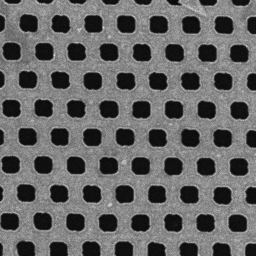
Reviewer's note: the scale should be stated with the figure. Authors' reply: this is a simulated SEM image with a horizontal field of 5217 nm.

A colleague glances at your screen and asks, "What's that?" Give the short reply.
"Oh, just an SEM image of a regular array of holes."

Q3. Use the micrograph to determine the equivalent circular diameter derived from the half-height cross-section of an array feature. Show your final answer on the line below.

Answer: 400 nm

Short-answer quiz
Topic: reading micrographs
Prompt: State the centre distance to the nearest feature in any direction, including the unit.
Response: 0.657 um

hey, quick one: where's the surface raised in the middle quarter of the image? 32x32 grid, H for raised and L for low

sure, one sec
HHHHHHHHHHHHHHHHHHHHHHHHHHHHHHHH
HHHHHHHHHHHHHHHHHHHHHHHHHHHHHHHH
LHHHHLLLLHHHHLLLLHHHHHLLLHHHHHLL
LHHHHLLLLLHHHLLLLLHHHLLLLLHHHLLL
LHHHHLLLLLHHHLLLLLHHHLLLLLHHHLLL
LHHHHLLLLHHHHLLLLLHHHLLLLLHHHLLL
HHHHHHLHHHHHHHHHHHHHHHLLLHHHHHHL
HHHHHHHHHHHHHHHHHHHHHHHHHHHHHHHH
HHHHHHHHHHHHHHHHHHHHHHHHHHHHHHHH
HLLLLHHHHLLLLHHHHHLLLHHHHHLLLHHH
HLLLLHHHHLLLLLHHHLLLLLHHHLLLLLHH
HLLLLHHHHLLLLLHHHLLLLLHHHLLLLLHH
HLLLLHHHHLLLLLHHHLLLLLHHHLLLLLHH
HHHHHHHHHHHHHHHHHHLLLHHHHHLLLHHH
HHHHHHHHHHHHHHHHHHHHHHHHHHHHHHHH
HHHHHHHHHHHHHHHHHHHHHHHHHHHHHHHH
LHHHHLLLLHHHHLLLLHHHHHLLLHHHHHLL
LHHHHLLLLLHHHLLLLLHHHLLLLLHHHLLL
LHHHHLLLLLHHHLLLLLHHHLLLLLHHHLLL
LHHHHLLLLLHHHLLLLLHHHLLLLLHHHLLL
HHHHHHLLHHHHHHLLLHHHHHLLLHHHHHLL
HHHHHHHHHHHHHHHHHHHHHHHHHHHHHHHH
HHHHHHHHHHHHHHHHHHHHHHHHHHHHHHHH
HLLLLHHHHLLLLHHHHHLLLHHHHHLLLHHH
HLLLLHHHHLLLLHHHHLLLLHHHHLLLLLHH
HLLLLHHHHLLLLLHHHLLLLLHHHLLLLLHH
HLLLLHHHHLLLLHHHHLLLLLHHHLLLLLHH
HHLLHHHHHLLLLHHHHHLLLHHHHHLLLHHH
HHHHHHHHHHHHHHHHHHHHHHHHHHHHHHHH
HHHHHHHHHHHHHHHHHHHHHHHHHHHHHHHH
HHHHHLLLHHHHHLLLLHHHHHLLLHHHHHHL
LHHHLLLLLHHHHLLLLHHHHLLLLHHHHLLL